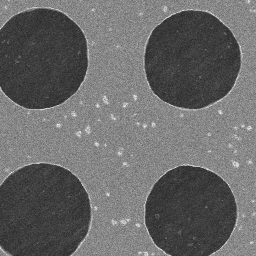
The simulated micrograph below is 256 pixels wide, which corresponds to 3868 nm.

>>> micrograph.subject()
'holes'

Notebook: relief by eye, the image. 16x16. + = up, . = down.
++.+++++++++++++
.....+++++....++
.....++++......+
.....++++......+
.....++++......+
.....++++.....++
+...+++++++..+++
++++++++++++++++
++++++++++++++++
++++++++++++++++
+...+++++++..+++
.....+++++....++
......+++......+
......+++......+
.....++++......+
.....+++++....++